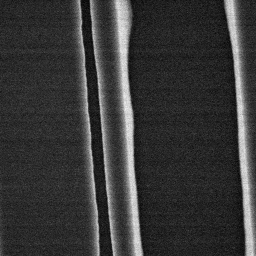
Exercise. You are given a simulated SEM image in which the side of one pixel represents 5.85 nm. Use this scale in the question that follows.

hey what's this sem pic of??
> lines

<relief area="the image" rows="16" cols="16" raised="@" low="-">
@@@@@@@@------@@
@@@@@@@@------@@
@@@@@@@@-------@
@@@@@@@@-------@
@@@@@@@@-------@
@@@@@@@@-------@
@@@@@@@@-------@
@@@@@@@@-------@
@@@@@@@@-------@
@@@@@@@@-------@
@@@@@@@@-------@
@@@@@@@@-------@
@@@@@@@@-------@
@@@@@@@@-------@
@@@@@@@@@-------
@@@@@@@@@-------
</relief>